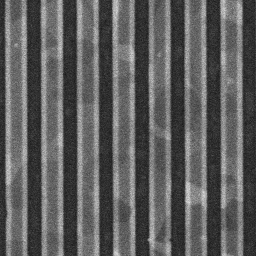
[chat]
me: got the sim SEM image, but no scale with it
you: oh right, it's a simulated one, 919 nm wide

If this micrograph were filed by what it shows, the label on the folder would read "parallel lines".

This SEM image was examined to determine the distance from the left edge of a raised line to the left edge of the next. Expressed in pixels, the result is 35.8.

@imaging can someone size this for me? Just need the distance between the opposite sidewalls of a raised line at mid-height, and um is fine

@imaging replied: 0.0623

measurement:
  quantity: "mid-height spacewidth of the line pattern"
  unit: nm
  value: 68.6